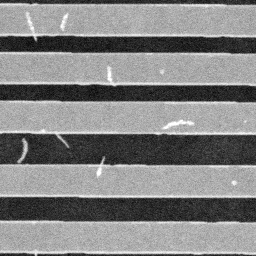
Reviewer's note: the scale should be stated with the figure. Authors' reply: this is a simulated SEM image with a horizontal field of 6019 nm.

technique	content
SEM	lines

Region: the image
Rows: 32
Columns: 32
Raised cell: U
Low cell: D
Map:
DDDDDDDDDDDDDDDDDDDDDDDDDDDDDDDD
UUUUUUUUUUUUUUUUUUUUUUUUUUUUUUUU
UUUUUUUUUUUUUUUUUUUUUUUUUUUUUUUU
UUUUUUUUUUUUUUUUUUUUUUUUUUUUUUUU
DDDDUDDDDDDDDDDDDDDDDDDDDDDDDDUU
DDDDDDDDDDDDDDDDDDDDDDDDDDDDDDDD
DDDDDDDDDDDDDDDDDDDDDDDDDDDDDDDD
UUUUUUUUUUUUUUUUUUUUUUUUUUUUUUUU
UUUUUUUUUUUUUUUUUUUUUUUUUUUUUUUU
UUUUUUUUUUUUUUUUUUUUUUUUUUUUUUUU
DDDDDDDDDDDDDUUDDUUUUUUUUUUUUUUU
DDDDDDDDDDDDDDDDDDDDDDDDDDDDDDDD
DDDDDDDDDDDDDDDDDDDDDDDDDDDDDDDD
UUUUUUUUUUUUUUUUUUUUUUUUUUUUUUUU
UUUUUUUUUUUUUUUUUUUUUUUUUUUUUUUU
UUUUUUUUUUUUUUUUUUUUUUUUUUUUUUUU
UUUUUUUUUUUUUUUUUUUUUUUUUUUUUUUU
DDDDDDDDDDDDDDDDDDDDDDDDDDDDDDDD
DDDDDDDDDDDDDDDDDDDDDDDDDDDDDDDD
DDDDDDDDDDDDDDDDDDDDDDDDDDDDDDDD
DDDDDDDDDDDDDDDDDDDDDDDDDDDDDDDD
UUUUUUUUUUUUUUUUUUUUUUUUUUUUUUUU
UUUUUUUUUUUUUUUUUUUUUUUUUUUUUUUU
UUUUUUUUUUUUUUUUUUUUUUUUUUUUUUUU
UUUUUUUUUUUUUUUUUUUUUUUUUUUUUUUU
DDDDDDDDDDDDDDDDDDDDDDDDDDDDDDDD
DDDDDDDDDDDDDDDDDDDDDDDDDDDDDDDD
DDDDDDDDDDDDDDDDDDDDDDDDDDDDDDDD
UUUUUUUUUUUUUUUUUUUUUUUUUUUUUUUU
UUUUUUUUUUUUUUUUUUUUUUUUUUUUUUUU
UUUUUUUUUUUUUUUUUUUUUUUUUUUUUUUU
UUUUUUUUUUUUUUUUUUUUUUUUUUUUUUUU